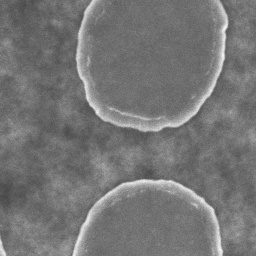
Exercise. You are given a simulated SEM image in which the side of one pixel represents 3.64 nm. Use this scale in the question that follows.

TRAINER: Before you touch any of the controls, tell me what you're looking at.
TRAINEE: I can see raised bodies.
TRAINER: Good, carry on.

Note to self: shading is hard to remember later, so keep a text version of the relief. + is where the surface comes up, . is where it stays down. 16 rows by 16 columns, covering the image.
......++++++++..
.....+++++++++..
.....+++++++++..
.....+++++++++..
.....+++++++++..
.....++++++++...
......+++++++...
.......++++.....
................
................
................
........+++.....
......++++++....
......+++++++...
.....+++++++++..
.....+++++++++..